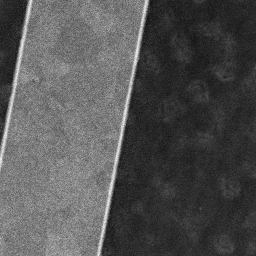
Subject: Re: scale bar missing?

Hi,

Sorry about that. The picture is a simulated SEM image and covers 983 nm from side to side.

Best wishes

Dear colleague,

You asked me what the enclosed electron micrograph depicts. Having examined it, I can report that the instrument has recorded one or a few lines or trenches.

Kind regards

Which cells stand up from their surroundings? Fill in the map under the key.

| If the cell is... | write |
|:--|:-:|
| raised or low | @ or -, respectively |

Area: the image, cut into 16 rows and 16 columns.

--@@@@@@@-------
--@@@@@@@-------
-@@@@@@@@-------
-@@@@@@@@-------
-@@@@@@@--------
-@@@@@@@--------
-@@@@@@@--------
-@@@@@@@--------
@@@@@@@@--------
@@@@@@@---------
@@@@@@@---------
@@@@@@@---------
@@@@@@@---------
@@@@@@@---------
@@@@@@----------
@@@@@@----------